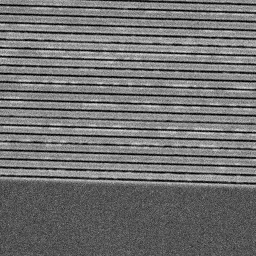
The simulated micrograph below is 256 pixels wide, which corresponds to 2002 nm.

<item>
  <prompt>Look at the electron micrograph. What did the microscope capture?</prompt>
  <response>parallel lines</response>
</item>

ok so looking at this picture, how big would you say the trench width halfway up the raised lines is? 15.6 nm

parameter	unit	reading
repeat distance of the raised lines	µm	0.0667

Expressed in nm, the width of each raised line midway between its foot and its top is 52.8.